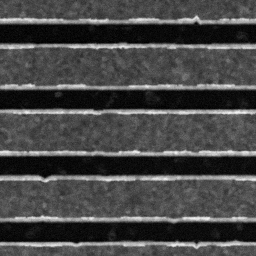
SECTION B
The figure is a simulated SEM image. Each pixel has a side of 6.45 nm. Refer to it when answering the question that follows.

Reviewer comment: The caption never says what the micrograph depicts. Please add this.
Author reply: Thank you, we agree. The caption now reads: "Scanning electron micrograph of one or a few lines or trenches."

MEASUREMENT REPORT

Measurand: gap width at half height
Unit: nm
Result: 155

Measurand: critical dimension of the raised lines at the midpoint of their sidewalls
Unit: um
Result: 0.275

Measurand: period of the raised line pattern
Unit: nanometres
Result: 427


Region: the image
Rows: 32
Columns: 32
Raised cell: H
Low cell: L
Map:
HHHHHHHHHHHHHHHHHHHHHHHHHHHHHHHH
HHHHHHHHHHHHHHHHHHHHHHHHHHHHHHHH
HHHHHHHHHHHHHHHHHHHHHHHHHHHHHHHH
LLLLLLLLLLLLLLLLLLLLLLLLLLLLLLLL
LLLLLLLLLLLLLLLLLLLLLLLLLLLLLLLL
LLLLLLLLLLLLLLLLLLLLLLLLLLLLLLLL
HHHHHHHHHHHHHHHHHHHHHHHHHHHHHHHH
HHHHHHHHHHHHHHHHHHHHHHHHHHHHHHHH
HHHHHHHHHHHHHHHHHHHHHHHHHHHHHHHH
HHHHHHHHHHHHHHHHHHHHHHHHHHHHHHHH
HHHHHHHHHHHHHHHHHHHHHHHHHHHHHHHH
LLLLLLLLLLLLLLLLLLLLLLLLLLLLLLLL
LLLLLLLLLLLLLLLLLLLLLLLLLLLLLLLL
LLLLLLLLLLLLLLLLLLLLLLLLLLLLLLLL
HHHHHHHHHHHHHHHHHHHHHHHHHHHHHHHH
HHHHHHHHHHHHHHHHHHHHHHHHHHHHHHHH
HHHHHHHHHHHHHHHHHHHHHHHHHHHHHHHH
HHHHHHHHHHHHHHHHHHHHHHHHHHHHHHHH
HHHHHHHHHHHHHHHHHHHHHHHHHHHHHHHH
LLLLLLLLLLLLLLLLLLLLLLLLLLLLLLLL
LLLLLLLLLLLLLLLLLLLLLLLLLLLLLLLL
LLLLLLLLLLLLLLLLLLLLLLLLLLLLLLLL
HHHHHHHHHHHHHHHHHHHHHHHHHHHHHHHH
HHHHHHHHHHHHHHHHHHHHHHHHHHHHHHHH
HHHHHHHHHHHHHHHHHHHHHHHHHHHHHHHH
HHHHHHHHHHHHHHHHHHHHHHHHHHHHHHHH
HHHHHHHHHHHHHHHHHHHHHHHHHHHHHHHH
LLLLLLLLLLLLLLLLLLLLLHLLLLLLLLLL
LLLLLLLLLLLLLLLLLLLLLLLLLLLLLLLL
LLLLLLLLLLLLLLLLLLLLLLLLLLLLLLLL
LLLLLLLLLLLLLLLLLLLLLLHLLLLLHHLL
HHHHHHHHHHHHHHHHHHHHHHHHHHHHHHHH